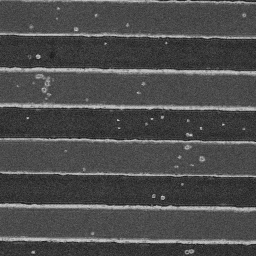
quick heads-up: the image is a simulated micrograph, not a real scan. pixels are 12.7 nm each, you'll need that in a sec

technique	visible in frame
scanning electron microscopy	lines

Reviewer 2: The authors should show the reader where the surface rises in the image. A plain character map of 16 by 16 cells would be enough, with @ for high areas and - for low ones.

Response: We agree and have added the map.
@@@@@@@@@@@@@@@@
@@@@@@@@@@@@@@@@
----------------
----------------
@@@@@@@@@@@@@@@@
@@@@@@@@@@@@@@@@
@@@@@@@@@@@@@@@@
----------------
----------------
@@@@@@@@@@@@@@@@
@@@@@@@@@@@@@@@@
----------------
----------------
@@@@@@@@@@@@@@@@
@@@@@@@@@@@@@@@@
----------------